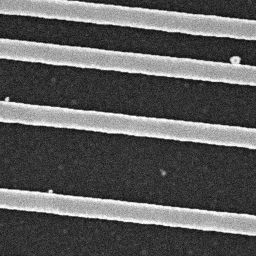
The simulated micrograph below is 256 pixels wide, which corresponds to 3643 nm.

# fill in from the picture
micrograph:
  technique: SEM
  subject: lines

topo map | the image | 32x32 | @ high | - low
@@@@@@@@@@@---------------------
@@@@@@@@@@@@@@@@@@@@@-----------
---------@@@@@@@@@@@@@@@@@@@@@@-
-------------------@@@@@@@@@@@@@
----------------------------@@@@
@@@@@---------------------------
@@@@@@@@@@@@@@------------------
---@@@@@@@@@@@@@@@@@@@@@@-------
------------@@@@@@@@@@@@@@@@@@@@
---------------------@@@@@@@@@@@
------------------------------@@
--------------------------------
--------------------------------
@@@@@@@-------------------------
@@@@@@@@@@@@@@@@----------------
---@@@@@@@@@@@@@@@@@@@@@@-------
---------------@@@@@@@@@@@@@@@@@
-----------------------@@@@@@@@@
-------------------------------@
--------------------------------
--------------------------------
--------------------------------
--------------------------------
--------------------------------
@@@@@@@@------------------------
@@@@@@@@@@@@@@@@@@--------------
------@@@@@@@@@@@@@@@@@@@@@-----
---------------@@@@@@@@@@@@@@@@@
------------------------@@@@@@@@
--------------------------------
--------------------------------
--------------------------------